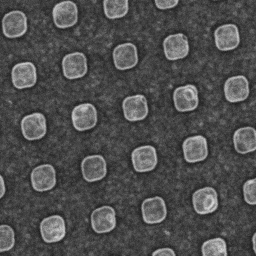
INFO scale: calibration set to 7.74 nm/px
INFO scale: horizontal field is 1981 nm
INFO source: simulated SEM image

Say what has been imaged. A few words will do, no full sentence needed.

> a regular array of raised bodies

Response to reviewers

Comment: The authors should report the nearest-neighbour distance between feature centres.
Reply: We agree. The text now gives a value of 0.399 microns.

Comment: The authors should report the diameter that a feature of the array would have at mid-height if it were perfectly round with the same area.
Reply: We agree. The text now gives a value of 197 nanometres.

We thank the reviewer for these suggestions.